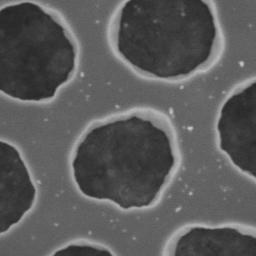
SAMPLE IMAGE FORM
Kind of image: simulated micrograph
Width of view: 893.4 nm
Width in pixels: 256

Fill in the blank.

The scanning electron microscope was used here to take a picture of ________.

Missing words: holes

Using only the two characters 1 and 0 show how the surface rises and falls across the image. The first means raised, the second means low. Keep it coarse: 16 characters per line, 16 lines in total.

0001111100000111
0000111000000111
0000111000000011
0000011100000111
0000011110001111
0000111111111110
1111111111111100
1111111000111100
1111100000011100
0111100000011100
0011100000011110
0011100000111111
0011111000111111
0111111111111111
1111111111110001
1111001111100000